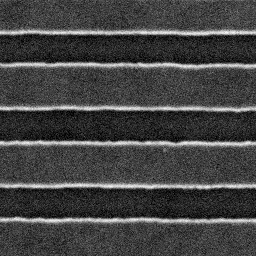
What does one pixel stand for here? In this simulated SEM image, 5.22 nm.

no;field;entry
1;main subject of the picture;lines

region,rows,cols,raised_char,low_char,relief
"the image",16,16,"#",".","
################
################
................
................
################
################
################
................
................
################
################
################
................
................
################
################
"